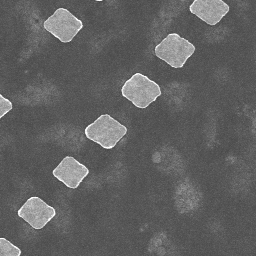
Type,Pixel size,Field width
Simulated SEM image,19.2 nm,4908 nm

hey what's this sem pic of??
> raised bodies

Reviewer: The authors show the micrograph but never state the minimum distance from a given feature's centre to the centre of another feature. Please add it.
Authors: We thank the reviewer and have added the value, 52.9 px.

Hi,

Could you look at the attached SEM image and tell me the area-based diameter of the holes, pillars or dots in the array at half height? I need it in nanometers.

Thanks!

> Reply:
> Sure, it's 626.